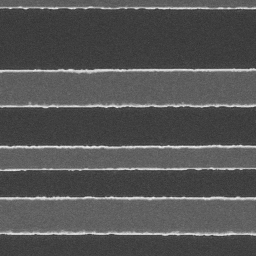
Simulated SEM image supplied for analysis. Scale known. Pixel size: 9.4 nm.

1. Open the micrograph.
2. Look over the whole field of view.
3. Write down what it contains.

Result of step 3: lines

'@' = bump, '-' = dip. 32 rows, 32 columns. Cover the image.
@@@@@@@@@@@@@@@@@@@@@@@@@@@@@@@@
--------------------------------
--------------------------------
--------------------------------
--------------------------------
--------------------------------
--------------------------------
--------------------------------
--------------------------------
@@@@@@@@@@@@@@@@@@@@@@@@@@@@@@@@
@@@@@@@@@@@@@@@@@@@@@@@@@@@@@@@@
@@@@@@@@@@@@@@@@@@@@@@@@@@@@@@@@
@@@@@@@@@@@@@@@@@@@@@@@@@@@@@@@@
--------------------------------
--------------------------------
--------------------------------
--------------------------------
--------------------------------
@@@@@@@@@@@@@@@@@@@@@@@@@@@@@@@@
@@@@@@@@@@@@@@@@@@@@@@@@@@@@@@@@
@@@@@@@@@@@@@@@@@@@@@@@@@@@@@@@@
--------------------------------
--------------------------------
--------------------------------
--------------------------------
@@@@@@@@@@@@@@@@@@@@@@@@@@@@@@@@
@@@@@@@@@@@@@@@@@@@@@@@@@@@@@@@@
@@@@@@@@@@@@@@@@@@@@@@@@@@@@@@@@
@@@@@@@@@@@@@@@@@@@@@@@@@@@@@@@@
--------------------------------
--------------------------------
--------------------------------